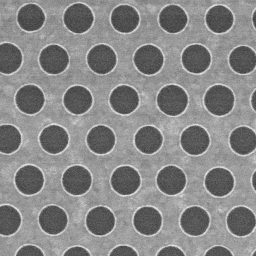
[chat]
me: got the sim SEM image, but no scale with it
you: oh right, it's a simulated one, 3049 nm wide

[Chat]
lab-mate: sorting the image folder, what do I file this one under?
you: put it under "a regular array of holes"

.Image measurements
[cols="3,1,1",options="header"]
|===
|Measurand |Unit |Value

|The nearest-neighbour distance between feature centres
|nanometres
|551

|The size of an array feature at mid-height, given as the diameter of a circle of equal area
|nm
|360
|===